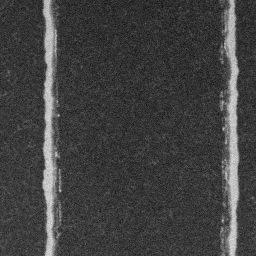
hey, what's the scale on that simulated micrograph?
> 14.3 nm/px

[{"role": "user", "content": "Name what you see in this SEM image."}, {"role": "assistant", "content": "one or a few lines or trenches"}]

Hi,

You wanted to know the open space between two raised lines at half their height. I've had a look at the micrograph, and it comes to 2650 nanometers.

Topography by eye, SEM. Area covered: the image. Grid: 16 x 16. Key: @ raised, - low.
@@@------------@
@@@------------@
@@@-----------@@
@@@------------@
@@@------------@
@@@------------@
@@@------------@
@@@------------@
@@@------------@
@@@------------@
@@@------------@
@@@------------@
@@@------------@
@@@------------@
@@@------------@
@@@------------@